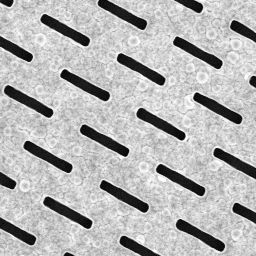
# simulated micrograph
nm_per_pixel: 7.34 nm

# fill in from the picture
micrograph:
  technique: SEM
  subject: a regular array of holes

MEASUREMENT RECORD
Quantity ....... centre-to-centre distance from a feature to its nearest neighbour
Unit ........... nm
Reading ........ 430